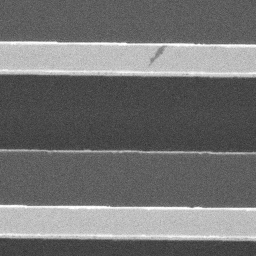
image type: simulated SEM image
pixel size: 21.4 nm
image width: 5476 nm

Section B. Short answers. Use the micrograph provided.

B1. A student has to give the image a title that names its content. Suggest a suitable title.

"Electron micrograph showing lines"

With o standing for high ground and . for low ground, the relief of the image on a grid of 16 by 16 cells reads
oooooooooooooooo
oooooooooooooooo
oooooooooooooooo
oooooooooooooooo
......oooooooooo
................
................
................
................
ooooo...........
oooooooooooooooo
oooooooooooooooo
oooooooooooooooo
oooooooooooooooo
oooooooooooooooo
................